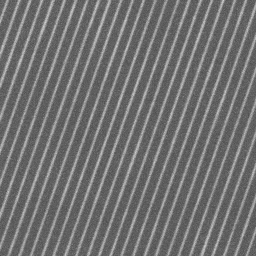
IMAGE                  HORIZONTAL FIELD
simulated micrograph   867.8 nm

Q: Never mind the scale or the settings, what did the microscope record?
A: parallel lines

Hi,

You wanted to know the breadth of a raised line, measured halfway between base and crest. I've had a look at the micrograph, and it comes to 1.89 px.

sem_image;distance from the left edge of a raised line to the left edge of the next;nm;36.3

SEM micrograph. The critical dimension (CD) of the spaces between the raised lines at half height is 31.6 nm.